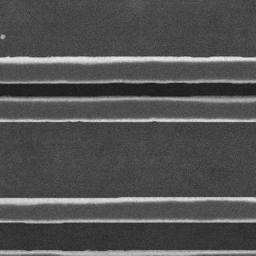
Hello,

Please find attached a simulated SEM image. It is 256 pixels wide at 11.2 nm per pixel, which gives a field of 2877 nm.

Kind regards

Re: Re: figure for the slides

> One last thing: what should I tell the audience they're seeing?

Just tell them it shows lines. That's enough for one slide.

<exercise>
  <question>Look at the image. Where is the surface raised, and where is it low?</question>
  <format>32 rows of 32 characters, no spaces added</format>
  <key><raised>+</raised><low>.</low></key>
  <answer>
................................
................................
................................
................................
................................
................................
................................
++++++++++++++++++++++++++++++++
++++++++++++++++++++++++++++++++
++++++++++++++++++++++++++++++++
................................
................................
++++++++++++++++++++++++++++++++
++++++++++++++++++++++++++++++++
++++++++++++++++++++++++++++++++
................................
................................
................................
................................
................................
................................
................................
................................
................................
................................
++++++++++++++++++++++++++++++++
++++++++++++++++++++++++++++++++
++++++++++++++++++++++++++++++++
................................
................................
................................
++++++++...............+++++++++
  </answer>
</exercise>